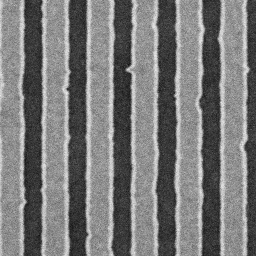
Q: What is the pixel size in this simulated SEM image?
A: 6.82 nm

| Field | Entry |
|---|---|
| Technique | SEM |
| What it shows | parallel lines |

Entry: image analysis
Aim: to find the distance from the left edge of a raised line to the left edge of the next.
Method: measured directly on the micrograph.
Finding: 304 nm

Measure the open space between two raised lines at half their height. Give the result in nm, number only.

144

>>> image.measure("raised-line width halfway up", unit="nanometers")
156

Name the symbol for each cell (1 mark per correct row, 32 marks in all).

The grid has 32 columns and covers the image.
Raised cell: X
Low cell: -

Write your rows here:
XXX--XXX---XXX---XXX--XXX---XXX-
XXX--XXX---XXX---XXX--XXX---XXX-
XXX--XXX---XXX---XX---XXX---XXX-
XXX--XXX---XXX---XX---XXX---XXX-
XXX--XXX---XXX---XXX--XXX---XXX-
XXX--XXX---XXX---XXX--XXX---XXX-
XXX---XX---XXX---XX---XXX---XXX-
XXX--XXX---XXX---XXX--XXX---XXX-
XXX--XXX---XXX--XXXX--XXX---XXX-
XXX--XXXX--XXX---XXX--XXX---XXX-
XXX--XXX---XXX---XXX--XXX---XXX-
XXX---XX---XXX---XXX--XXX---XXX-
XXX---XX---XXX---XXX--XXX---XXX-
XXX---XX---XXX---XXX--XXX---XXX-
XXX--XXX---XXX---XXX--XXX---XXX-
XXX--XXX---XXX---XXX--XXX---XXX-
XXX--XXX---XXX---XX---XXX---XXX-
XXX--XXX---XXX---XXX--XXX---XXX-
XXX--XXX---XXX---XXX--XXX---XX--
XXX--XXX---XXX---XXX--XXX---XXX-
XXX--XXX---XXX---XXX--XXX---XXX-
XXX--XXX---XXX---XXX--XXX---XXX-
XXX--XXX---XXX---XX---XXX---XXX-
XXX--XXX---XXX---XX---XXX---XXX-
XXX--XXX---XXX---XXX--XXX---XXX-
XXX---XX---XXX---XXX--XXX---XXX-
XXX--XXX---XXX---XX---XXX---XXX-
XXX--XXX---XXX---XX---XXX---XXX-
XXX---XX---XXX---XXX--XXX---XXX-
XXX--XXX---XXX---XXX--XXX---XXX-
XXX--XXX---XXX---XXX--XXX---XXX-
XXX--XXX---XXX---XX---XXX---XXX-